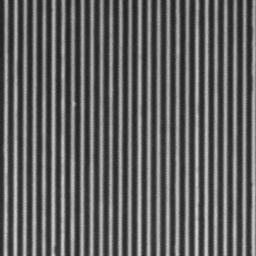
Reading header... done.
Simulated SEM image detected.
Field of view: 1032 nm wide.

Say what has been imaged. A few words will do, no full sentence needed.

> parallel lines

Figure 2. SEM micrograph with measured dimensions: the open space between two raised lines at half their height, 24.7 nanometres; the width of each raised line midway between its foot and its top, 0.0141 um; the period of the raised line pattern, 0.0385 micrometres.